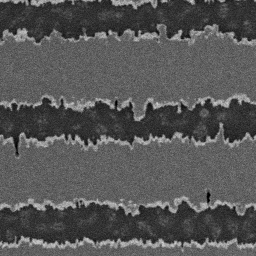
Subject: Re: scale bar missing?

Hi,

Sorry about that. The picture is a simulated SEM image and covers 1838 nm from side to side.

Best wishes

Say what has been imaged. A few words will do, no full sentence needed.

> one or a few lines or trenches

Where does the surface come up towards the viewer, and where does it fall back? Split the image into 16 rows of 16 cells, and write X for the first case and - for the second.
----------------
----------------
XXXXXXXXXXXXXXX-
XXXXXXXXXXXXXXXX
XXXXXXXXXXXXXXXX
XXXXXXXXXXXXXXXX
-X--XX-XXXXX----
----------------
-------------X--
XXXXXXXXXXXXXXXX
XXXXXXXXXXXXXXXX
XXXXXXXXXXXXXXXX
XXXXXXXXXXXXXXXX
----------------
----------------
XXXXXXXXXXXXXXXX